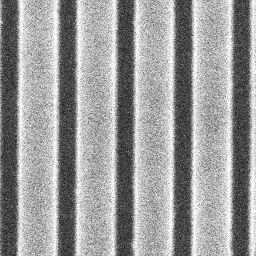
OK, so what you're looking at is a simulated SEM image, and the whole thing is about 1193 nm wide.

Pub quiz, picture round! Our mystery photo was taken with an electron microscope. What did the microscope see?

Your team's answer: parallel lines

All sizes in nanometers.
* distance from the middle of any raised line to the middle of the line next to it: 271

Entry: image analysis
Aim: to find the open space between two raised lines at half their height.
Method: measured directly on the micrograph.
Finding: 88.6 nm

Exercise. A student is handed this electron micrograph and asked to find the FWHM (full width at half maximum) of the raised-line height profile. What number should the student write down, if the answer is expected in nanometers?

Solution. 181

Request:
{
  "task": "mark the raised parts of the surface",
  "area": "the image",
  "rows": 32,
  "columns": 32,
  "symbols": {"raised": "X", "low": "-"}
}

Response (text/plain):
--XXXXX---XXXX---XXXXX--XXXXX---
--XXXXX---XXXX---XXXXX--XXXXX---
--XXXXX---XXXX---XXXXX--XXXXX---
--XXXXX---XXXX---XXXXX--XXXXX--X
--XXXXX---XXXX---XXXXX--XXXXX--X
--XXXXX---XXXX---XXXXX--XXXXX--X
--XXXXX---XXXX---XXXXX--XXXXX--X
--XXXXX---XXXX---XXXXX--XXXXX--X
--XXXXX---XXXX---XXXXX--XXXXX--X
--XXXXX---XXXX---XXXXX--XXXXX--X
--XXXXX---XXXX---XXXXX--XXXXX--X
--XXXXX---XXXX---XXXXX--XXXXX--X
--XXXXX---XXXX---XXXXX--XXXXX--X
--XXXXX---XXXX---XXXXX--XXXXX--X
--XXXXX---XXXX---XXXXX--XXXXX--X
--XXXXX---XXXX---XXXXX--XXXXX--X
--XXXXX---XXXX---XXXXX--XXXXX--X
--XXXXX---XXXX---XXXXX--XXXXX--X
--XXXXX---XXXX---XXXXX--XXXXX--X
--XXXXX---XXXX---XXXXX--XXXXX--X
--XXXXX---XXXX---XXXXX--XXXXX--X
--XXXXX---XXXX---XXXXX--XXXXX--X
--XXXXX---XXXX---XXXXX--XXXXX--X
--XXXXX--XXXXX---XXXXX--XXXXX--X
--XXXXX--XXXXX---XXXXX--XXXXX--X
--XXXXX---XXXX---XXXXX--XXXXX--X
--XXXXX---XXXX---XXXXX--XXXXX--X
--XXXXX---XXXX---XXXXX--XXXXX--X
--XXXXX---XXXX---XXXXX--XXXXX--X
--XXXXX---XXXX---XXXXX--XXXXX--X
--XXXXX---XXXX---XXXXX--XXXXX--X
--XXXXX---XXXX---XXXXX--XXXXX--X